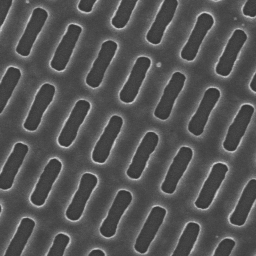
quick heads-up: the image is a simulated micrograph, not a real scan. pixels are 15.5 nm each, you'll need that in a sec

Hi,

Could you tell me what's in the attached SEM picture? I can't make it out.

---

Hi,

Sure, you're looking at a regular array of holes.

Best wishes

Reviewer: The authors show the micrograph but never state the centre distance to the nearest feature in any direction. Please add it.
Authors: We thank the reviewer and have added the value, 0.58 µm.